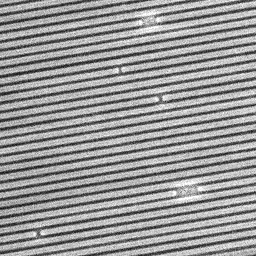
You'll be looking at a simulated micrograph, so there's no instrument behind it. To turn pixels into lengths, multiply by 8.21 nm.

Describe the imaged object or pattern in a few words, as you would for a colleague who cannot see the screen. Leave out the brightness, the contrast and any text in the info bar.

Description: parallel lines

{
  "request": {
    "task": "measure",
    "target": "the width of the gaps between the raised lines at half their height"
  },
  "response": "0.0314 micrometres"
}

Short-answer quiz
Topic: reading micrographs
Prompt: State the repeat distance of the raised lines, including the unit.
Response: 71.4 nm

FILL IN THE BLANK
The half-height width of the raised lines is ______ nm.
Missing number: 38.5